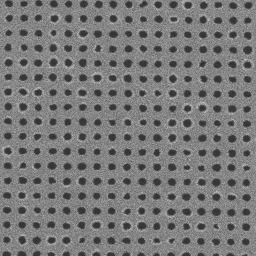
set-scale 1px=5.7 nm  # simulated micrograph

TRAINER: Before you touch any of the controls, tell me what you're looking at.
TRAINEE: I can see a regular array of holes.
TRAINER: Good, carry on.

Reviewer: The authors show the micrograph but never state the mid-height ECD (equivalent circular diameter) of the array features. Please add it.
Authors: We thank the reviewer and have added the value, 0.0417 micrometres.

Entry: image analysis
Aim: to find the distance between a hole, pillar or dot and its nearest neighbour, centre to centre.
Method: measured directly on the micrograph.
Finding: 81.8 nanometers